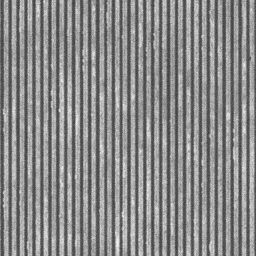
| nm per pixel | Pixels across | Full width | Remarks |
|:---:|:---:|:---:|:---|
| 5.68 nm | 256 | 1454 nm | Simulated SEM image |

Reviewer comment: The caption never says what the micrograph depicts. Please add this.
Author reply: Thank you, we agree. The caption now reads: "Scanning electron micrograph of parallel lines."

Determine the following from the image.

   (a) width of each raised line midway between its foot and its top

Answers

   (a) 0.0213 microns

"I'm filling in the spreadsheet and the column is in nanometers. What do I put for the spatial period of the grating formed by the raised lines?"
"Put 45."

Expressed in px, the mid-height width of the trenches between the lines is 4.75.